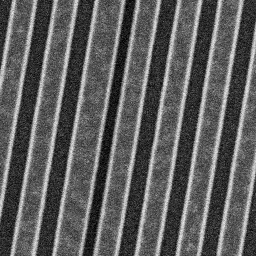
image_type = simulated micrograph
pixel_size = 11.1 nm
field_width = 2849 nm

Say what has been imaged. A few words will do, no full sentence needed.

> parallel lines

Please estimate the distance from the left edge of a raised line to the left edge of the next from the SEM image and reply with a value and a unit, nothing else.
40.6 px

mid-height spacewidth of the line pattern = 0.199 um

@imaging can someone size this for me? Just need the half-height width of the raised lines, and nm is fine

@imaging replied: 247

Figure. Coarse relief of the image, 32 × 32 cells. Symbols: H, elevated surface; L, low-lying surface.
LLHHLLLHHHLLHHHLLHHHLLHHHLLHHHLL
LHHHLLLHHLLLHHHLLHHHLLHHHLLHHHLL
LHHHLLHHHLLLHHHLLHHHLLHHHLLHHHLL
LHHHLLHHHLLHHHHLLHHLLLHHLLLHHHLL
LHHHLLHHHLLHHHHLHHHLLLHHLLLHHHLL
LHHHLLHHHLLHHHHLHHHLLHHHLLLHHLLL
LHHLLLHHHLLHHHLLHHHLLHHHLLHHHLLL
HHHLLLHHLLLHHHLLHHHLLHHHLLHHHLLH
HHHLLHHHLLLHHHLLHHHLLHHHLLHHHLLH
HHHLLHHHLLHHHHLLHHLLLHHHLLHHHLLH
HHHLLHHHLLHHHHLHHHLLLHHLLLHHHLLH
HHHLLHHHLLHHHHLHHHLLHHHLLLHHLLLH
HHLLLHHHLLHHHLLHHHLLHHHLLHHHLLLH
HHLLLHHLLLHHHLLHHHLLHHHLLHHHLLHH
HHLLHHHLLLHHHLLHHHLLHHHLLHHHLLHH
HHLLHHHLLHHHHLLHHLLLHHHLLHHHLLHH
HHLLHHHLLHHHHLHHHLLLHHLLLHHLLLHH
HHLLHHHLLHHHHLHHHLLHHHLLLHHLLLHH
HLLLHHHLLHHHLLHHHLLHHHLLHHHLLHHH
HLLLHHLLLHHHLLHHHLLHHHLLHHHLLHHH
HLLHHHLLLHHHLLHHHLLHHHLLHHHLLHHH
HLLHHHLLHHHHLLHHLLLHHHLLHHHLLHHH
HLLHHHLLHHHHLHHHLLHHHLLLHHLLLHHH
HLLHHHLLHHHHLHHHLLHHHLLLHHLLLHHH
LLLHHHLLHHHLLHHHLLHHHLLHHHLLHHHL
LLLHHLLLHHHLLHHHLLHHHLLHHHLLHHHL
LLHHHLLLHHHLLHHHLLHHHLLHHHLLHHHL
LLHHHLLHHHHLLHHLLLHHHLLHHHLLHHHL
LLHHHLLHHHHLHHHLLHHHLLLHHLLLHHHL
LLHHHLLHHHHLHHHLLHHHLLLHHLLLHHLL
LLHHHLLHHHLLHHHLLHHHLLHHHLLHHHLL
LLHHLLLHHHLLHHHLLHHHLLHHHLLHHHLL